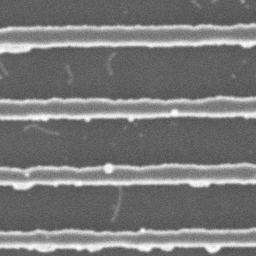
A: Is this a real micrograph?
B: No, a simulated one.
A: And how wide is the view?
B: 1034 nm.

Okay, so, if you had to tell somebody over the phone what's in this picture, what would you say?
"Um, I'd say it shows lines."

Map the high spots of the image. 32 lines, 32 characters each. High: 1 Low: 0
00000000000000000000000000000000
00000000000000000000000000000000
00000000000000000000000000000000
01111111111111111111111111111111
11111111111111111111111111111111
11111111111111111111111111000000
00000000000000000000000000000000
00000000000000000000000000000000
00000000000000000000000000000000
00000000000000000000000000000000
00000000000000000000000000000000
00000000000000000000000000000000
00000011110111000110001001111111
11111111111111111111111111111111
11111111111111111111110000100000
00000000000000000000000000000000
00000000000000000000000000000000
00000000000000000000000000000000
00000000000000000000000000000000
00000000000000000000000000000000
00000000000000000000000000000010
11111111111111111111111111111111
11111111111111111111111111111111
00000000000000000000000000000000
00000000000000000000000000000000
00000000000000000000000000000000
00000000000000000000000000000000
00000000000000000000000000000000
00000000000000000000000000000000
11111111111111111111111111111111
11111111111111111111111111111111
00000000000000000000000000000000